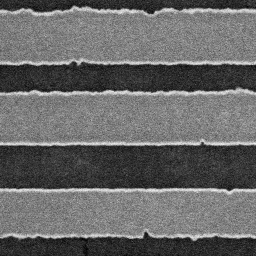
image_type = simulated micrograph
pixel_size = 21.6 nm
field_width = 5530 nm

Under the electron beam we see one or a few lines or trenches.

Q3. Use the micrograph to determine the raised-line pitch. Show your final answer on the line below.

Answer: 1900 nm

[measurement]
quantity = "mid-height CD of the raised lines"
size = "1100 nanometres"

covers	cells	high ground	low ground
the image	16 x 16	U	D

DDDDDDDDDDDDDDDD
UUUUUUUUUUUUUUUU
UUUUUUUUUUUUUUUU
UUUUUUUUUUUUUUUU
DDDDDDDDDDDDDDDD
DDDDDDDDDDDDDDDD
UUUUUUUUUUUUUUUU
UUUUUUUUUUUUUUUU
UUUUUUUUUUUUUUUU
DDDDDDDDDDDDDDDD
DDDDDDDDDDDDDDDD
DDDDDDDDDDDDDDDD
UUUUUUUUUUUUUUUU
UUUUUUUUUUUUUUUU
UUUUUUUUUUUUUUUU
DDDDDDDDDDDDDDDD